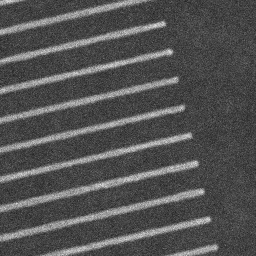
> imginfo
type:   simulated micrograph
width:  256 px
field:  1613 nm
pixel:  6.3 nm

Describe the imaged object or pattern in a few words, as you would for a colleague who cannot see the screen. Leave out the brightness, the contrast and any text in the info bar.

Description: parallel lines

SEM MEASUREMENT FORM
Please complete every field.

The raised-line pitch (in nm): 181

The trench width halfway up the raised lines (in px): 24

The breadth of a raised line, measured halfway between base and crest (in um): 0.0276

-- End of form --